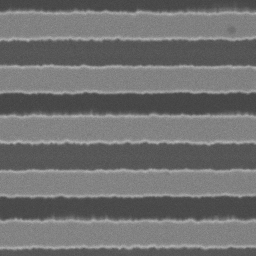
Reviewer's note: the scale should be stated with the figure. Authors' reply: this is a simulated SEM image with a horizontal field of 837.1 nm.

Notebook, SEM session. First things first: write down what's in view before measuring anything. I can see lines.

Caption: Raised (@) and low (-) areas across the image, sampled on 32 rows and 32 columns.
--------------------------------
-@@@@----@@@@@---@----------@@@-
@@@@@@@@@@@@@@@@@@@@@@@@@@@@@@@@
@@@@@@@@@@@@@@@@@@@@@@@@@@@@@@@@
@@@@@@@@@@@@@@@@@@@@@@@@@@@@@@@@
--------------------------------
--------------------------------
--------------------------------
@@@@@@@@@@@@@@@@@@@@@@@@@@@@@@@@
@@@@@@@@@@@@@@@@@@@@@@@@@@@@@@@@
@@@@@@@@@@@@@@@@@@@@@@@@@@@@@@@@
@@@@@@@@@@@@@@@@@@@@@@@@@@@@@@@@
--------------------------------
--------------------------------
@@-@@@@@@@@@@@@@@@@@@@@@@@@@@@@@
@@@@@@@@@@@@@@@@@@@@@@@@@@@@@@@@
@@@@@@@@@@@@@@@@@@@@@@@@@@@@@@@@
@@@@@@@@@@@@@@@@@@@@@@@@@@@@@@@@
--------------------------------
--------------------------------
--------------------------------
@@@@@@@@@@@@@@@@@@@@@@@@@@@@@@@@
@@@@@@@@@@@@@@@@@@@@@@@@@@@@@@@@
@@@@@@@@@@@@@@@@@@@@@@@@@@@@@@@@
@@-@@@@-@@@@@@-@@@------@----@@-
--------------------------------
--------------------------------
-@@---@-@--------------@-----@--
@@@@@@@@@@@@@@@@@@@@@@@@@@@@@@@@
@@@@@@@@@@@@@@@@@@@@@@@@@@@@@@@@
@@@@@@@@@@@@@@@@@@@@@@@@@@@@@@@@
--------------------------------